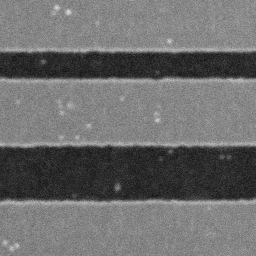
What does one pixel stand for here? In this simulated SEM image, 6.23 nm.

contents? lines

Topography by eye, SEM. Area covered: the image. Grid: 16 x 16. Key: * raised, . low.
****************
****************
****************
................
................
****************
****************
****************
****************
................
................
................
................
****************
****************
****************